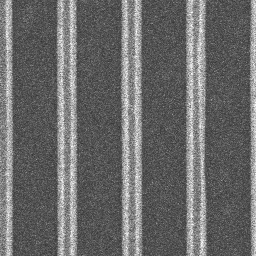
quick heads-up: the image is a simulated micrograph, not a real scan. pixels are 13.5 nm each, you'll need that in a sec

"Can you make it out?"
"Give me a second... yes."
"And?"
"one or a few lines or trenches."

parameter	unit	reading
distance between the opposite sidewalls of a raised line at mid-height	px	13.4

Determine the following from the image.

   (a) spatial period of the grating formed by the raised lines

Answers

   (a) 870 nm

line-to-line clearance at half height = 682 nanometers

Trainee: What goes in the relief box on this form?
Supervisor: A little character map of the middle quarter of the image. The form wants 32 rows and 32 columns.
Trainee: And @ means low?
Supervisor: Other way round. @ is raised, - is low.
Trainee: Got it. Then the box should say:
@@-------------@@@-------------@
@@-------------@@@@------------@
@@-------------@@@@------------@
@@-------------@@@@------------@
@@-------------@@@@------------@
@@-------------@@@@------------@
@@-------------@@@@------------@
@@-------------@@@@------------@
@@-------------@@@@------------@
@@-------------@@@@------------@
@@-------------@@@@------------@
@@-------------@@@@------------@
@@-------------@@@@------------@
@@-------------@@@@------------@
@@-------------@@@@------------@
@@-------------@@@@------------@
@@-------------@@@@------------@
@@-------------@@@@------------@
@@-------------@@@@------------@
@@-------------@@@@------------@
@@-------------@@@@------------@
@@-------------@@@@------------@
@@-------------@@@@------------@
@@-------------@@@@------------@
@@-------------@@@@------------@
@@@------------@@@@------------@
@@@------------@@@@------------@
@@@------------@@@@------------@
@@-------------@@@@------------@
@@-------------@@@@------------@
@@-------------@@@@------------@
@@-------------@@@@------------@